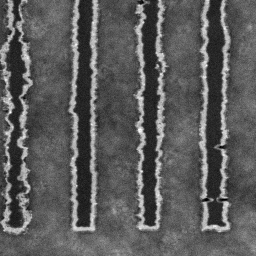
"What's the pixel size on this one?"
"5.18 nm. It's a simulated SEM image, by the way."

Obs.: one or a few lines or trenches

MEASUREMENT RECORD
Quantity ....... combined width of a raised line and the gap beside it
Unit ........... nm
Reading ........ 343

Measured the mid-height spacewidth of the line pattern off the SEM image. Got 242 nm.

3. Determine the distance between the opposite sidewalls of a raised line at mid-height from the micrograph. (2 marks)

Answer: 100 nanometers